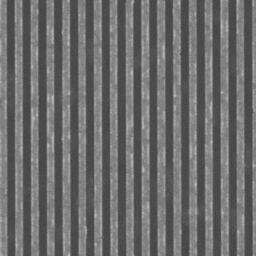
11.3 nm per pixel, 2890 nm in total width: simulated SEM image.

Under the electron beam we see parallel lines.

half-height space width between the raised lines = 8.62 px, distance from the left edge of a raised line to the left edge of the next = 179 nm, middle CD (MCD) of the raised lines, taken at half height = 0.0818 micrometres